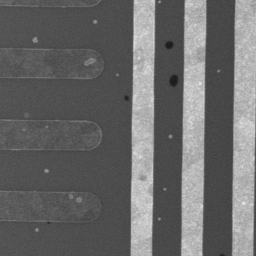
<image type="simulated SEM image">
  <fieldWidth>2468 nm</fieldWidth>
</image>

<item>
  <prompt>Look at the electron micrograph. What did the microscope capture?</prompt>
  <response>groups of lines, slits or small figures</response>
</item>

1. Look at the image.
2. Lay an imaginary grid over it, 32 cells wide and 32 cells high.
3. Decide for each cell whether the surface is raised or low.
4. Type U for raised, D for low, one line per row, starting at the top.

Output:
UUUUUUUUUUUUDDDDDUUDDDDUUUDDDDUU
DDDDDDDDDDDDDDDDDUUDDDDUUUDDDUUU
DDDDDDDDDDDDDDDDDUUDDDDUUUDDDUUU
DDDDDDDDDDDDDDDDDUUDDDDUUUDDDUUU
DDDDDDDDDDDDDDDDDUUDDDDUUUDDDUUU
DDDDDDDDDDDDDDDDDUUDDDDUUUDDDUUU
UUUUUUUUUUUUDDDDDUUDDDDUUUDDDUUU
UUUUUUUUUUUUUDDDDUUDDDDUUUDDDUUU
UUUUUUUUUUUUUDDDDUUDDDDUUDDDDUUU
UUUUUUUUUUUUDDDDDUUDDDDUUDDDDUUU
DDDDDDDDDDDDDDDDDUUDDDDUUDDDDUUU
DDDDDDDDDDDDDDDDDUUDDDDUUDDDDUUU
DDDDDDDDDDDDDDDDDUUDDDDUUDDDDUUU
DDDDDDDDDDDDDDDDDUUDDDDUUDDDDUUU
DDDDDDDDDDDDDDDDDUUDDDDUUDDDDUUU
UUUUUUUUUUUUDDDDDUUDDDDUUDDDDUUU
UUUUUUUUUUUUUDDDDUUDDDDUUDDDDUUU
UUUUUUUUUUUUUDDDDUUDDDDUUDDDDUUU
UUUUUUUUUUUUDDDDDUUDDDDUUDDDDUUU
DDDDDDDDDDDDDDDDDUUDDDDUUDDDDUUU
DDDDDDDDDDDDDDDDDUUDDDDUUDDDDUUU
DDDDDDDDDDDDDDDDDUUDDDDUUDDDDUUU
DDDDDDDDDDDDDDDDDUUDDDDUUDDDDUUU
DDDDDDDDDDDDDDDDDUUDDDDUUDDDDUUU
UUUUUUUUUUUUDDDDDUUDDDDUUDDDDUUU
UUUUUUUUUUUUUDDDDUUDDDDUUDDDDUUU
UUUUUUUUUUUUDDDDUUUDDDDUUDDDDUUU
UUUUUUUUUUUUDDDDUUUDDDDUUDDDDUUU
DDDDDDDDDDDDDDDDDUUDDDDUUDDDDUUU
DDDDDDDDDDDDDDDDUUUDDDDUUDDDDUUU
DDDDDDDDDDDDDDDDUUUDDDDUUDDDDUUU
DDDDDDDDDDDDDDDDUUUDDDDUUDDDDUUU